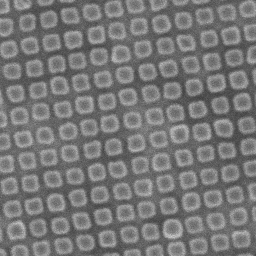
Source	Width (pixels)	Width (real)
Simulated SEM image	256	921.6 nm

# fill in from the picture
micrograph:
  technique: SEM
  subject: a regular array of raised bodies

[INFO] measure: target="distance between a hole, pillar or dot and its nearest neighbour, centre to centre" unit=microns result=0.0778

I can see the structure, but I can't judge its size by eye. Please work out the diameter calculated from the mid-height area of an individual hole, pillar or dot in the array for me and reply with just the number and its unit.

63.5 nanometres